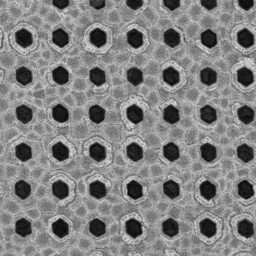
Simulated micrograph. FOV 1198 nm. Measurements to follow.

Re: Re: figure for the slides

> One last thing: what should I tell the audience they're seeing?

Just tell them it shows a regular array of holes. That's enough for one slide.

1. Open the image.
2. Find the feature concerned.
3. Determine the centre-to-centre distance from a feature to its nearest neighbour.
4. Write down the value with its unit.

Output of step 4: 0.172 microns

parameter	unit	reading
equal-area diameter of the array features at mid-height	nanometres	85.3